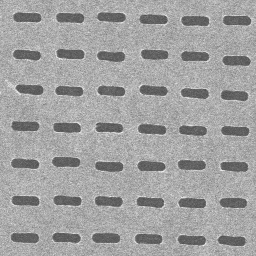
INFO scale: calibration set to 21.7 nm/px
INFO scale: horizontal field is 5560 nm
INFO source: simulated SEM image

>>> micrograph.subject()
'a regular array of holes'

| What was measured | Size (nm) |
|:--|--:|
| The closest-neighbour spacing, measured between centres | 782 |